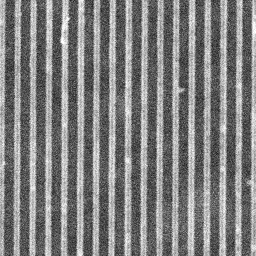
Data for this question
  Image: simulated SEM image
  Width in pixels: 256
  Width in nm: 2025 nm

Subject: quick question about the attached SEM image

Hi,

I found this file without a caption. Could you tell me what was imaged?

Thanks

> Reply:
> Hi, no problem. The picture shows parallel lines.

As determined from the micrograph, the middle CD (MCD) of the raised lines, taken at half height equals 0.0366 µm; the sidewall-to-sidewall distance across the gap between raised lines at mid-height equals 11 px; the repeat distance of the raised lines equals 0.125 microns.